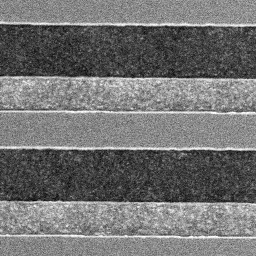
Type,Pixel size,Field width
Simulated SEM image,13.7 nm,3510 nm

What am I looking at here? lines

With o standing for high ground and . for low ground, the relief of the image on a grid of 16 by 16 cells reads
oooooooooooooooo
.......ooooooooo
................
................
................
oooooooooooooooo
oooooooooooooooo
oooooooooooooooo
oooooooooooooooo
................
................
................
................
oooooooooooooooo
oooooooooooooooo
oooooooooooooooo